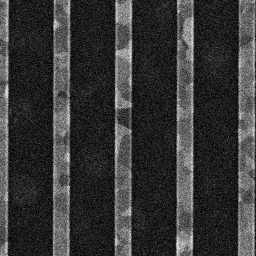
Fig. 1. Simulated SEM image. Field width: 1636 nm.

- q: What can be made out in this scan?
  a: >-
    parallel lines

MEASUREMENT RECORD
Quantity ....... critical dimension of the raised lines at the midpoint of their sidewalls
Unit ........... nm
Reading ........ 95.9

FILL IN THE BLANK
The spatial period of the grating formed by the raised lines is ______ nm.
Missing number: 394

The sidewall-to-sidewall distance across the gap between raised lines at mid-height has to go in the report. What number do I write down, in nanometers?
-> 299